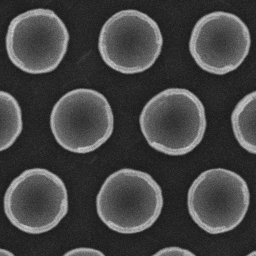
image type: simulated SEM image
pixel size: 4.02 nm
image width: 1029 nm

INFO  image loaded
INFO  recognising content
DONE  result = a regular array of raised bodies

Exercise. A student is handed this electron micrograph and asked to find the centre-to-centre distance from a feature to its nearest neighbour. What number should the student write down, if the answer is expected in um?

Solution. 0.363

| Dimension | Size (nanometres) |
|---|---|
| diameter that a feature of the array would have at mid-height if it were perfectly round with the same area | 249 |